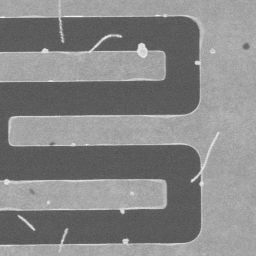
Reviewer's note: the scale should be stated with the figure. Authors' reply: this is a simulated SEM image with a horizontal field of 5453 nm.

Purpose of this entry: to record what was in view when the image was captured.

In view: groups of lines, slits or small figures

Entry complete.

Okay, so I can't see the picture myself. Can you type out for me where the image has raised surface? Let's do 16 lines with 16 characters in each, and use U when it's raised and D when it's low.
UUUUUUUUUUUUUUUU
DDDDDDDDDDDDUUUU
DDDDDDDDDDDDDUUU
UUUUUUUUUUDDUUUU
UUUUUUUUUUDDUUUU
DDDDDDDDDDDDDUUU
DDDDDDDDDDDDUUUU
DUUUUUUUUUUUUUUU
DUUUUUUUUUUUUUUU
DDDDDDDDDDDDUUUU
DDDDDDDDDDDDDUUU
UUUUUUUUUUDDDUUU
UUUUUUUUUUDDDUUU
DDDDDDDDDDDDDUUU
DDDDDDDDDDDDUUUU
UUUUUUUUUUUUUUUU